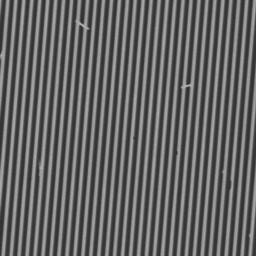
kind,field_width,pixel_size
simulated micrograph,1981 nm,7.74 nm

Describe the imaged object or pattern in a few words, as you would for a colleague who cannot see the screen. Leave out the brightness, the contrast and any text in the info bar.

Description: parallel lines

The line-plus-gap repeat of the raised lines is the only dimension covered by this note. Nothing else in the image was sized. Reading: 61.5 nm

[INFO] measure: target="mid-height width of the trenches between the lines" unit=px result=4.61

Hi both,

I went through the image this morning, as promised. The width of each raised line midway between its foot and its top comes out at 28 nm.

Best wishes